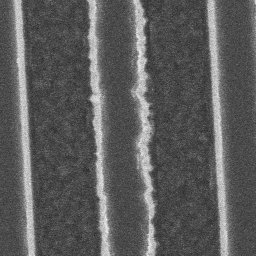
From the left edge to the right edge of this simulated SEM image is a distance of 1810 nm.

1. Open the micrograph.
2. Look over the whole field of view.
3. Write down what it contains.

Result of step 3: one or a few lines or trenches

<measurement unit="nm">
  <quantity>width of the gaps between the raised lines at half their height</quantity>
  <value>510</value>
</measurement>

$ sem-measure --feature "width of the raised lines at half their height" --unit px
48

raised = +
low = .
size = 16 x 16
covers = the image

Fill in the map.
+.....+++....+++
+.....+++....+++
+.....+++....+++
+.....+++....+++
+.....+++....+++
+.....+++....+++
++....+++....+++
++....+++.....++
++....+++.....++
++....+++.....++
++....+++.....++
++....+++.....++
++....+++.....++
++....+++.....++
++....++++....++
++.....++.....++